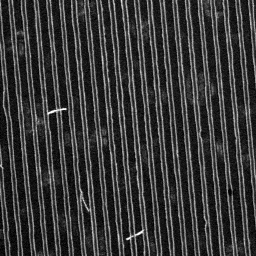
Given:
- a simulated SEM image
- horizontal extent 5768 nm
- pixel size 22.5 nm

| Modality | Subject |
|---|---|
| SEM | parallel lines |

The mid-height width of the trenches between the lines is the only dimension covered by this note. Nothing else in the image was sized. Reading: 182 nanometres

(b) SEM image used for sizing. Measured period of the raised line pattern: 283 nanometers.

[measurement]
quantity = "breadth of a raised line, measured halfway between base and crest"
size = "101 nm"